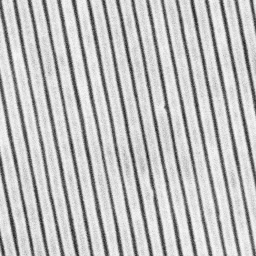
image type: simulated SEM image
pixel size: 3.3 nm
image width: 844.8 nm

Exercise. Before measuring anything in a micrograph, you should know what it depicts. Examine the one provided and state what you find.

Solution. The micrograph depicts parallel lines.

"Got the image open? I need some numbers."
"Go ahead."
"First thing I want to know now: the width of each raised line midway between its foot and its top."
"33.3 nm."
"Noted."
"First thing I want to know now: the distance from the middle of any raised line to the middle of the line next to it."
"47.9 nm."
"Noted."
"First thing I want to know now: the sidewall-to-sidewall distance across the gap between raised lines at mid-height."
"0.0138 µm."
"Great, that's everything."